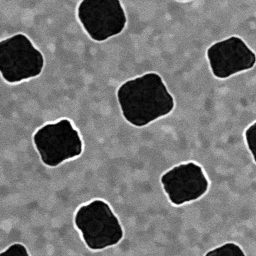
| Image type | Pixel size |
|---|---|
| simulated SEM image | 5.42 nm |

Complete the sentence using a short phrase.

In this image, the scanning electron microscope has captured holes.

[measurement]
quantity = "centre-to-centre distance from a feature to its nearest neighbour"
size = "500 nanometres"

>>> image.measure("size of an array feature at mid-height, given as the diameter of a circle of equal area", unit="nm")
246